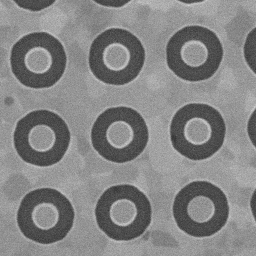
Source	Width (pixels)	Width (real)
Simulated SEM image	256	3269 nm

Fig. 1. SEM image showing an array of small figures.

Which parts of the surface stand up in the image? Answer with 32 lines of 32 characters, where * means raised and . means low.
**.....*****....*******.********
****.***************************
********************************
**************.********...******
***....*****.....****......****.
**......***.......***.......**..
*.......***.......***.......**..
*.......***.......***.......***.
*.......***.......***......****.
**......****.....*****.....*****
***....******...****************
********************************
********************************
**************..*******....*****
***.....****......****......***.
**......****......***.......***.
**.......**........**.......***.
**.......**........**.......***.
**.......***......****......****
**......*****....******...******
****...*************************
********************************
********************************
*****.*******....******....*****
***.....*****.....****......***.
**.......***.......***.......**.
**.......***.......***.......**.
**.......***.......***......****
**.......***......****......****
***.....*****....*******..******
*****.**************************
********************************